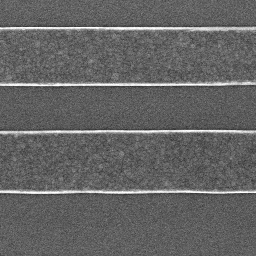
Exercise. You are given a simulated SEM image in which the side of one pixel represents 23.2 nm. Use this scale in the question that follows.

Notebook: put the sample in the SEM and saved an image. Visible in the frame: wiring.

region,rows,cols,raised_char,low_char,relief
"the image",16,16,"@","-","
----------------
----------------
@@@@@@@@@@@@@@@@
@@@@@@@@@@@@@@@@
@@@@@@@@@@@@@@@@
----------------
----------------
----------------
@@@@@@@@@@@@@@@@
@@@@@@@@@@@@@@@@
@@@@@@@@@@@@@@@@
@@@@@@@@@@@@@@@@
----------------
----------------
----------------
----------------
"